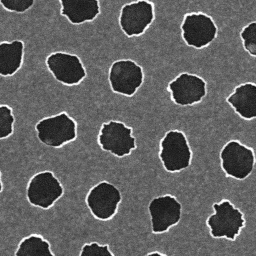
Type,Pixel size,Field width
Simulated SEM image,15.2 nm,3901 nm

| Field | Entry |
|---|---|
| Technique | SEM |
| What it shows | a regular array of holes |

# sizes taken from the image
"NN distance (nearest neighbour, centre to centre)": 926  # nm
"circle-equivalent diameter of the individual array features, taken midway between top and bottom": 507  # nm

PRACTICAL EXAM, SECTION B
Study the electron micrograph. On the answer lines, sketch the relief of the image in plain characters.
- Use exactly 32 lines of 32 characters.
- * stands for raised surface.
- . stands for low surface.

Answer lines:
....****....****...*************
********....***....*************
*********..****....****...******
***************...*****....****.
***********************....***..
...*********************..*****.
...*****************************
...***....**********************
..****....*****..***************
*******...****....****..********
**************....***.....******
***************..****.....***...
**********************...****...
.****************************...
..*****.**********************..
..***....****..*****************
.****....****...*****.**********
*****....***.....***...*********
*************....***....****...*
********************....****....
*********************...****....
****************************...*
****...*************************
****....****..******************
***....****....*****************
****..*****....****...*****..***
************..*****....****...**
*******************...****....**
*******************..*****....**
***************************..***
***...*****.********************
**....****....******************